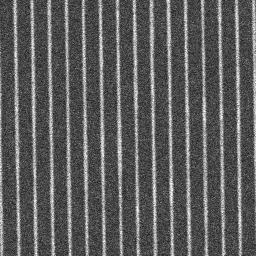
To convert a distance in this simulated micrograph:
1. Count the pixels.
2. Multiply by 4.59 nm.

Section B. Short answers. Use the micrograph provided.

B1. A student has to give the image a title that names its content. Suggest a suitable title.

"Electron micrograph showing parallel lines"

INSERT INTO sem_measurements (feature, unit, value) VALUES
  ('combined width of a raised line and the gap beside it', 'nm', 78.3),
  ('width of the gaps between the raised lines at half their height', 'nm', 70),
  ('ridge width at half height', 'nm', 10.3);